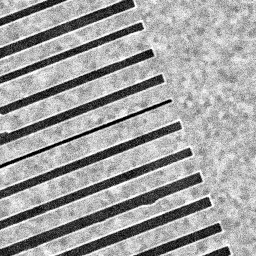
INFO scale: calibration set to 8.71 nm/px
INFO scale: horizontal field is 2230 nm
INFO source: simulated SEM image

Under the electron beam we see parallel lines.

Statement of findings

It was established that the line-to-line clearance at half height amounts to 82.3 nm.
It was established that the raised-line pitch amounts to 234 nm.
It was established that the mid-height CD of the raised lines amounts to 149 nanometers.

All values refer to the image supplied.